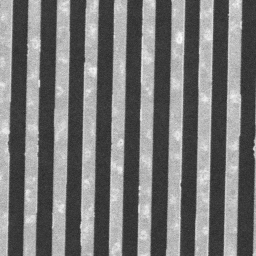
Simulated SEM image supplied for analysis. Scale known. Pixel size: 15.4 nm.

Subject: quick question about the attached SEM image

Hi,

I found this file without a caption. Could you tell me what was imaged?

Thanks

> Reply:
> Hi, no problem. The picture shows parallel lines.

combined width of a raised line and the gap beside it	444	nanometers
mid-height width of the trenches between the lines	256	nm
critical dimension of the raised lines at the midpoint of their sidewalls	0.183	µm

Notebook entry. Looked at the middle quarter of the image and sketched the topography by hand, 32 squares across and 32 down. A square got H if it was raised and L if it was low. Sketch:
HLLLLHHHLLLLLHHLLLLLHHLLLLLHHHLL
HLLLLHHHLLLLLHHLLLLLHHLLLLLHHHLL
HLLLLHHHLLLLLHHLLLLLHHLLLLLHHHLL
HLLLLHHHLLLLHHHLLLLLHHLLLLLHHLLL
HLLLLHHHLLLLHHHLLLLLHHLLLLLHHLLL
HLLLLHHHLLLLHHHLLLLLHHLLLLLHHLLL
HLLLLHHHLLLLHHHLLLLLHHLLLLLHHLLL
HLLLLHHHLLLLHHHLLLLLHHLLLLLHHLLL
HLLLLHHHLLLLHHHLLLLLHHLLLLLHHLLL
HLLLLHHHLLLLHHHLLLLHHHLLLLLHHLLL
HLLLLHHHLLLLHHHLLLLHHHLLLLLHHLLL
HLLLLHHHLLLLHHHLLLLHHHLLLLLHHLLL
HLLLLHHHLLLLHHHLLLLHHHLLLLLHHLLL
HLLLLHHHLLLLHHHLLLLHHHLLLLLHHLLL
HLLLLHHHLLLLHHHLLLLHHHLLLLLHHLLL
HLLLLHHHLLLLHHHLLLLHHHLLLLLHHLLL
HLLLLHHHLLLLHHHLLLLHHHLLLLHHHLLL
HLLLLHHHLLLLHHHLLLLHHHLLLLHHHLLL
HLLLLHHHLLLLHHHLLLLHHHLLLLHHHLLL
HLLLLHHHLLLLHHLLLLLHHHLLLLHHHLLL
HLLLLHHHLLLLHHHLLLLHHHLLLLHHHLLL
HLLLLHHHLLLLHHHLLLLHHHLLLLHHHLLL
HLLLLHHHLLLLHHHLLLLHHHLLLLHHHLLL
HLLLLHHHLLLLHHHLLLLHHHLLLLHHHLLL
HLLLLHHHLLLLHHHLLLLHHHLLLLHHHLLL
LLLLLHHHLLLLHHHLLLLHHHLLLLHHHLLL
LLLLLHHHLLLLHHLLLLLHHHLLLLHHHLLL
LLLLLHHHLLLLHHHLLLLHHHLLLLHHHLLL
LLLLLHHHLLLLHHHLLLLHHHLLLLHHHLLL
LLLLLHHHLLLLHHHLLLLHHHLLLLHHHLLL
LLLLLHHHLLLLHHHLLLLHHHLLLLHHHLLL
LLLLLHHHLLLLHHHLLLLHHHLLLLHHHLLL